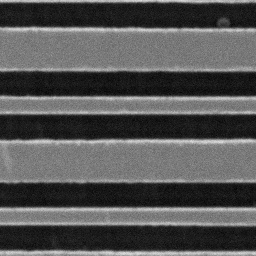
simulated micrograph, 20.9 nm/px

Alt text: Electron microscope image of lines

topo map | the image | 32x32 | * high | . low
................................
................................
................................
................................
********************************
********************************
********************************
********************************
********************************
................................
................................
................................
********************************
********************************
................................
................................
................................
....***..*...*******************
********************************
********************************
********************************
********************************
********************************
................................
................................
................................
********************************
********************************
................................
................................
................................
********************************